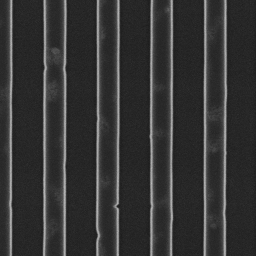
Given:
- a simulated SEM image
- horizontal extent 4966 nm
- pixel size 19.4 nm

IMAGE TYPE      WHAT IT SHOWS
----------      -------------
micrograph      parallel lines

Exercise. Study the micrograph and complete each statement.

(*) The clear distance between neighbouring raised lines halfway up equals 0.633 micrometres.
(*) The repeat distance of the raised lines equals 1040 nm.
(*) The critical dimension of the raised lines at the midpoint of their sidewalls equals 0.41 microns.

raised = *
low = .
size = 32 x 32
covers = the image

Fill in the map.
*.....**....***....**.....**....
*.....**....***....**.....**....
*.....**....***....**.....**....
*.....**....***....**.....**....
*.....**....***....**.....**....
*.....**....***....**.....**....
*.....**....***....**.....**....
*.....**....***....**.....**....
*.....**....***....**.....**....
*.....**....***....**.....**....
*.....**....***....**.....**....
*.....**....***....**.....**....
*.....**....***....**.....**....
*.....**....***....**.....**....
*.....**....***....**.....**....
*.....**....***....**.....**....
*.....**....***....**.....**....
*.....**....***....**.....**....
*.....**....***....**.....**....
*.....**....***....**.....**....
*.....**....***....**.....**....
*.....**....***....**.....**....
*.....**....***....**.....**....
*.....**....***....**.....**....
*.....**....***....**.....**....
*.....**....***....**.....**....
*.....**....***....**.....**....
*.....**....***....**.....**....
*.....**....***....**.....**....
*.....**....***....**.....**....
*.....**....***....**.....**....
*.....**....***....**.....**....